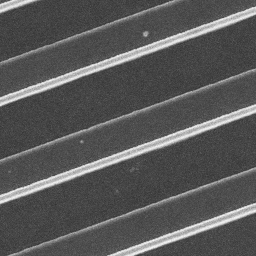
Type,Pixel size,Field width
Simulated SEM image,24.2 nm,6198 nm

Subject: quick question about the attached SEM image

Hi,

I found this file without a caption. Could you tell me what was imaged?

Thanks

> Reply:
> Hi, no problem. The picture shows lines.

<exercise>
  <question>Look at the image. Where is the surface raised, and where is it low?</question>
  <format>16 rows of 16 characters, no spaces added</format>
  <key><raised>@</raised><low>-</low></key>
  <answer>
@--------@@@@@@@
-------@@@@@@@--
----@@@@@@@-----
-@@@@@@@--------
@@@@@@---------@
@@@----------@@@
----------@@@@@@
-------@@@@@@@--
----@@@@@@@@----
-@@@@@@@@-------
@@@@@@----------
@@@----------@@@
----------@@@@@@
-------@@@@@@@@-
-----@@@@@@@----
--@@@@@@@-------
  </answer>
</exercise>